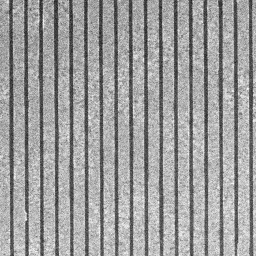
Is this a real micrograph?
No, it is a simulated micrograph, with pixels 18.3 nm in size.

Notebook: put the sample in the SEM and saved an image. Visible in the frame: parallel lines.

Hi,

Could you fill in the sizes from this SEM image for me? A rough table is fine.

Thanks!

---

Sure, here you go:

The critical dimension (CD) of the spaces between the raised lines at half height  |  79.9 nm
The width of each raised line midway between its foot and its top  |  192 nanometers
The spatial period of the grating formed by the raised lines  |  15 pixels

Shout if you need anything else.